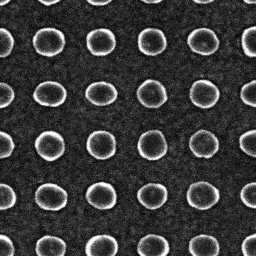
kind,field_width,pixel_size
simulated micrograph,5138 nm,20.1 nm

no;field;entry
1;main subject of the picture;a regular array of raised bodies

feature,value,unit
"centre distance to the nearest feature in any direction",1020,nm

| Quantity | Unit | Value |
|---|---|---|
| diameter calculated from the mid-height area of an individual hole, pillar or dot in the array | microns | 0.556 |